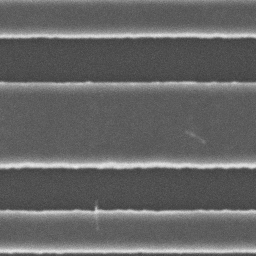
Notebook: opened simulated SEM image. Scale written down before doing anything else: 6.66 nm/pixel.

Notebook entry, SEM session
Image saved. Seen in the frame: lines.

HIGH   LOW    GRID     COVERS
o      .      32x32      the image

oooooooooooooooooooooooooooooooo
oooooooooooooooooooooooooooooooo
oooooooooooooooooooooooooooooooo
oooooooooooooooooooooooooooooooo
oooooooooooooooooo.ooo...ooooooo
................................
................................
................................
................................
................................
oooooooooooooooooooooooooooooooo
oooooooooooooooooooooooooooooooo
oooooooooooooooooooooooooooooooo
oooooooooooooooooooooooooooooooo
oooooooooooooooooooooooooooooooo
oooooooooooooooooooooooooooooooo
oooooooooooooooooooooooooooooooo
oooooooooooooooooooooooooooooooo
oooooooooooooooooooooooooooooooo
oooooooooooooooooooooooooooooooo
oooooooooooooooooooooooooooooooo
................................
................................
................................
................................
................................
oooo.ooooooooooooooooooooooooooo
oooooooooooooooooooooooooooooooo
oooooooooooooooooooooooooooooooo
oooooooooooooooooooooooooooooooo
oooooooooooooooooooooooooooooooo
.o..ooooo.ooooooo..oo.o.o..o...o